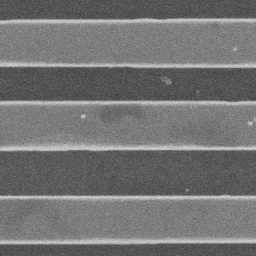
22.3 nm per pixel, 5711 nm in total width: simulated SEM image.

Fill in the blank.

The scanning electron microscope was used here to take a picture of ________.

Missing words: lines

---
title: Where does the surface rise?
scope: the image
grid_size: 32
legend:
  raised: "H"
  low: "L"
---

LLLLLLLLLLLLLLLLLLLLLLLLLLLLLLLL
LLLLLLLLLLLLLLLLLLLLLLLLLLLLLLLL
LLLLLLLLLLLLLLLLLHHLLHHHHHHHHHHH
HHHHHHHHHHHHHHHHHHHHHHHHHHHHHHHH
HHHHHHHHHHHHHHHHHHHHHHHHHHHHHHHH
HHHHHHHHHHHHHHHHHHHHHHHHHHHHHHHH
HHHHHHHHHHHHHHHHHHHHHHHHHHHHHHHH
HHHHHHHHHHHHHHHHHHHHHHHHHHHHHHHH
LLLLLLLLLLLLLLLLLLLLLLLLLLLLLLLL
LLLLLLLLLLLLLLLLLLLLLLLLLLLLLLLL
LLLLLLLLLLLLLLLLLLLLLLLLLLLLLLLL
LLLLLLLLLLLLLLLLLLLLLLLLLLLLLLLL
LLLLLLLLLLLLLLLLLLLLLLLLLLLLLLLL
HHHHHHHHHHHHHHHHHHHHHHHHHHHHHHHH
HHHHHHHHHHHHHHHHHHHHHHHHHHHHHHHH
HHHHHHHHHHHHHHHHHHHHHHHHHHHHHHHH
HHHHHHHHHHHHHHHHHHHHHHHHHHHHHHHH
HHHHHHHHHHHHHHHHHHHHHHHHHHHHHHHH
HHHHHHHHHHHHHHHHHHHHHHHHHHHHHHHH
LLLLLLLLLLLLLLLLLLLLLLLLLLLLLLLL
LLLLLLLLLLLLLLLLLLLLLLLLLLLLLLLL
LLLLLLLLLLLLLLLLLLLLLLLLLLLLLLLL
LLLLLLLLLLLLLLLLLLLLLLLLLLLLLLLL
LLLLLLLLLLLLLLLLLLLLLLLLLLLLLLLL
LLLLLLLLLLLLLLLLLLLLLLLLLLLLLLLL
HHHHHHHHHHHHHHHHHHHHHHHHHHHHHHHH
HHHHHHHHHHHHHHHHHHHHHHHHHHHHHHHH
HHHHHHHHHHHHHHHHHHHHHHHHHHHHHHHH
HHHHHHHHHHHHHHHHHHHHHHHHHHHHHHHH
HHHHHHHHHHHHHHHHHHHHHHHHHHHHHHHH
LLLLLLLLLLLLLLLLLLLLLLLLLLLLLLLL
LLLLLLLLLLLLLLLLLLLLLLLLLLLLLLLL